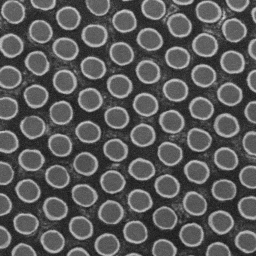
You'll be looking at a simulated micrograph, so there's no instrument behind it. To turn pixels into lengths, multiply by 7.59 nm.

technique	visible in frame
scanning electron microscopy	a regular array of raised bodies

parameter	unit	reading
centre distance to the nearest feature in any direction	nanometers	236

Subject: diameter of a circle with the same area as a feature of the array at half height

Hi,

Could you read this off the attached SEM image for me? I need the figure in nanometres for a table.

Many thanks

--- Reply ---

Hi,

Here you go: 167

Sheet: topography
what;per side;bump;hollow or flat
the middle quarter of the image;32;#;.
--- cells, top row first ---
....######.........####....###..
.....#####........######........
##...#####.........#####........
##.....#....####...####.........
###........#####....##....####..
###........######........#####..
##....##...#####.........######.
....#####...####.........######.
....#####.........####....####..
....#####.........#####.........
#...#####.........#####.........
##....#....####...#####.........
##........######...###...####...
##........######........#####...
#..........#####........######..
....####....###....##....#####..
...######........#####...####...
...######........#####.........#
#...####.........#####.........#
#..........###....####.........#
##........#####.........####....
##........#####.........#####...
#...##....#####.........#####...
...####....####.........#####...
...#####..........###....###....
...#####.........#####.........#
...#####........######........##
#....#....####...#####.........#
#........######...###...###....#
#........######........#####....
....##....#####........######...
..#####...####.........######...